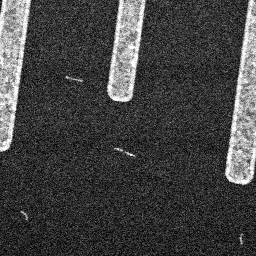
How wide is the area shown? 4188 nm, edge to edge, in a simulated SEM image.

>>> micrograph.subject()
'one or a few lines or trenches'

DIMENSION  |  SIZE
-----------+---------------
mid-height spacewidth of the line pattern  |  1620 nm